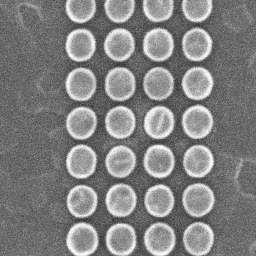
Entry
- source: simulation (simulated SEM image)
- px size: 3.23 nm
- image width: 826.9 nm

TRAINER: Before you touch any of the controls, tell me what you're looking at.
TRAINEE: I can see a regular array of raised bodies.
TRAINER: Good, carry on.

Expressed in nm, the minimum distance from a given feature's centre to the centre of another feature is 124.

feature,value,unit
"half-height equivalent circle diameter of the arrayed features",97.7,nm